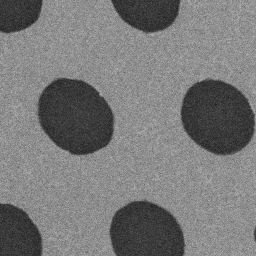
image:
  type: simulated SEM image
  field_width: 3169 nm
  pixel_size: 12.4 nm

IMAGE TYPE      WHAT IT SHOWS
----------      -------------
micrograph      holes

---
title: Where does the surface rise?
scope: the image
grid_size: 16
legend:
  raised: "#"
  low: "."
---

...####....#####
..######...#####
################
################
################
###...######...#
##.....####.....
##.....####.....
###....#####....
####..#######..#
################
################
################
..#####....#####
..#####....#####
...####.....####